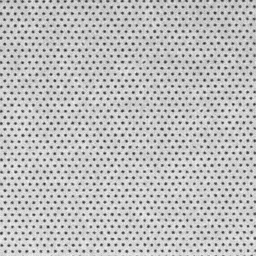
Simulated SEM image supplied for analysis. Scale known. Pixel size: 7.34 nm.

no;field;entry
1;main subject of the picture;a regular array of holes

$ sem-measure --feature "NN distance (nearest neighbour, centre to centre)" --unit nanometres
49.3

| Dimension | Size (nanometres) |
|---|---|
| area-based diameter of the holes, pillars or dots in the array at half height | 24.8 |